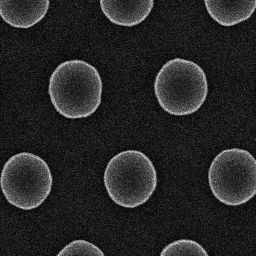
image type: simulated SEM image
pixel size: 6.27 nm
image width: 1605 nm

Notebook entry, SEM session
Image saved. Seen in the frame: raised bodies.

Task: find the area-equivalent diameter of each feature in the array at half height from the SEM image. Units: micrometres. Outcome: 0.333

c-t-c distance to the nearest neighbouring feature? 0.655 micrometres